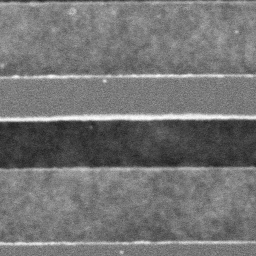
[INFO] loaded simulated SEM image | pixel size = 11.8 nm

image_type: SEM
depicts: lines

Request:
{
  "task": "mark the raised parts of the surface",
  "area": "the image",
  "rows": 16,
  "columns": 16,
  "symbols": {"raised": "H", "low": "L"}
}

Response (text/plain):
HHHHHHHHHHHHHHHH
HHHHHHHHHHHHHHHH
HHHHHHHHHHHHHHHH
HHHHHHHHHHHHHHHH
HHHHHHHHHHHHHHHH
HHHHHHHHHHHHHHHH
HHHHHHHHHHHHHHHH
HHHHLLLLLLLLLLLL
LLLLLLLLLLLLLLLL
LLLLLLLLLLLLLLLL
LLLLLLLLLLLLLHLH
HHHHHHHHHHHHHHHH
HHHHHHHHHHHHHHHH
HHHHHHHHHHHHHHHH
HHHHHHHHHHHHHHHH
HHHHHHHHHHHHHHHH